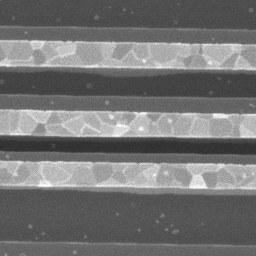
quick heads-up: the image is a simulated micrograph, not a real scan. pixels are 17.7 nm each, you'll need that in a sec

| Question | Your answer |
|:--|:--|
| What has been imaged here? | lines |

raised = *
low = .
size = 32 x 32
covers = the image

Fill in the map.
................................
................................
................................
**********......................
********************************
********************************
********************************
********************************
.........***********************
................................
................................
................................
********************************
********************************
********************************
********************************
********************************
................................
................................
********************************
********************************
********************************
********************************
................****************
................................
................................
................................
................................
................................
................................
***************.................
********************************